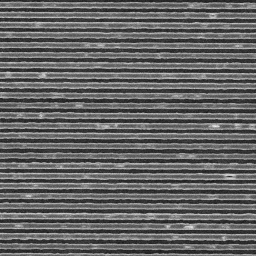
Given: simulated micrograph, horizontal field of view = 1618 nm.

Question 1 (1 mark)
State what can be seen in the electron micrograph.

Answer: parallel lines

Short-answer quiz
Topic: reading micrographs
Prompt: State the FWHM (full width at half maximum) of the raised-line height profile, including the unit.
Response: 34 nanometres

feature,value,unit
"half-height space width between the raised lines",4.51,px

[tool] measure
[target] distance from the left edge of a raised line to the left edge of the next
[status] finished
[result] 63.6 nm